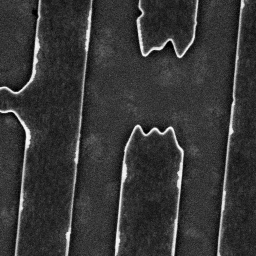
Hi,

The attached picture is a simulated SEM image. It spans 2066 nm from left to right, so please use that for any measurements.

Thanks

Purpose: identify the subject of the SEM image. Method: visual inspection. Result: one or a few lines or trenches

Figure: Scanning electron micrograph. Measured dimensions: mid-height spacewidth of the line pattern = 379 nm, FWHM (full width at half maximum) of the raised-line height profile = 426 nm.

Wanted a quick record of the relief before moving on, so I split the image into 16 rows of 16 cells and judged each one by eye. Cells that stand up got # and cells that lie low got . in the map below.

..####...###...#
..####...###...#
..####...###...#
..###..........#
..###..........#
.####..........#
#####..........#
.####.........##
..###...###...##
..###...###...##
.####...###...##
.####...###...##
.####...###...##
.###...####...##
.###...####...##
.###...####...##